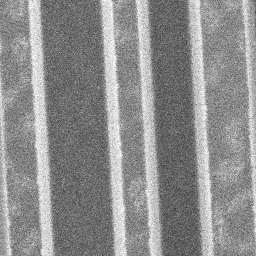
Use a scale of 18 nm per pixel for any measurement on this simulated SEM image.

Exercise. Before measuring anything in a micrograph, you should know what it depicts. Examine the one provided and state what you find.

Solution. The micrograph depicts one or a few lines or trenches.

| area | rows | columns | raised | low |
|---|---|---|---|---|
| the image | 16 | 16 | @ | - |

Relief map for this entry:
@@-----@@---@@@@
@@-----@@---@@@@
@@-----@@---@@@@
@@-----@@---@@@@
@@-----@@---@@@@
@@-----@@---@@@@
@@-----@@---@@@@
@@@----@@----@@@
@@@----@@----@@@
@@@----@@----@@@
@@@----@@----@@@
@@@----@@----@@@
@@@----@@@---@@@
@@@----@@@---@@@
@@@----@@@---@@@
@@@-----@@---@@@